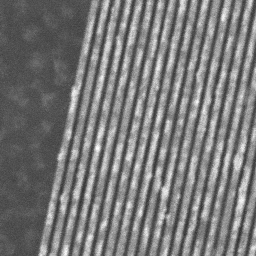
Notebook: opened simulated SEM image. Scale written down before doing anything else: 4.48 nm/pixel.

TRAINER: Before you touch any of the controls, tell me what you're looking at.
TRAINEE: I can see parallel lines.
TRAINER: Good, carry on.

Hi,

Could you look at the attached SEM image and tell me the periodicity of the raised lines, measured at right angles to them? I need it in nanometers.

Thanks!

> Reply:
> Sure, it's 48.4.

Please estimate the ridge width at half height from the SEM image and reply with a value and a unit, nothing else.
23.6 nm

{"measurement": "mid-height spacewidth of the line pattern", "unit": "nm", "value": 23.6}